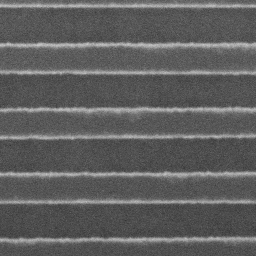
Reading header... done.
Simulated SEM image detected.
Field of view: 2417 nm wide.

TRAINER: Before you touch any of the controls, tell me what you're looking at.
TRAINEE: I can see lines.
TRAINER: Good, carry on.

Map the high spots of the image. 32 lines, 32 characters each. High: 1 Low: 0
11111111111111111111111111111111
00000000000000000000000000000000
00000000000000000000000000000000
00000000000000000000000000000000
00000000000000000000000000000000
00000000000010110000000000000000
11111111111111111111111111111111
11111111111111111111111111111111
11111111111111111111111111111111
00000000000000000000000000000000
00000000000000000000000000000000
00000000000000000000000000000000
00000000000000000000000000000000
00000000000000000000000000000000
11111111111111111111111111111111
11111111111111111111111111111111
11111111111111111111111111111111
00000000000000000000000000000000
00000000000000000000000000000000
00000000000000000000000000000000
00000000000000000000000000000000
00000000000000000000000000000000
11111111111111111111111111111111
11111111111111111111111111111111
11111111111111111111111111111111
00000000000000000000000000000000
00000000000000000000000000000000
00000000000000000000000000000000
00000000000000000000000000000000
00000000000000000000000000000000
11111111111111111111111111111111
11111111111111111111111111111111